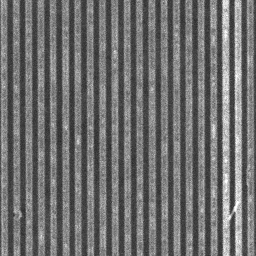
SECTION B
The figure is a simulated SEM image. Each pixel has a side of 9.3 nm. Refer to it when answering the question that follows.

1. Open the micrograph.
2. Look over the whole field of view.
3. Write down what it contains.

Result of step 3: parallel lines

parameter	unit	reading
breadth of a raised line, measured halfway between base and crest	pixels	6.13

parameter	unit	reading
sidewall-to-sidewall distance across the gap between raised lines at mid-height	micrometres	0.0581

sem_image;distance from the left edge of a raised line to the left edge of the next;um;0.115